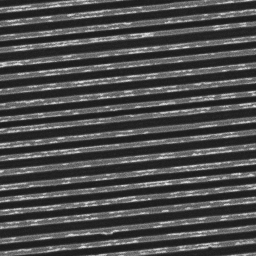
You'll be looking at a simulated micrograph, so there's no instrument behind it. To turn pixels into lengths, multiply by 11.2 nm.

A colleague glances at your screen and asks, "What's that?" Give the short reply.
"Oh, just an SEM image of parallel lines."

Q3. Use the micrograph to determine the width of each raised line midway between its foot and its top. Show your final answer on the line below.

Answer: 70.9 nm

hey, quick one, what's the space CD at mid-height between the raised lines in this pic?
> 77.8 nanometers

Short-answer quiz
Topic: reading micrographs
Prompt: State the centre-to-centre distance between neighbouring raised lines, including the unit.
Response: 150 nanometers